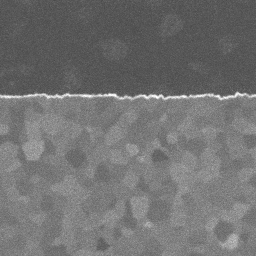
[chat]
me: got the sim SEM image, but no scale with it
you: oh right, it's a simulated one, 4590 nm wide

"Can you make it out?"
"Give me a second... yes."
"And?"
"one or a few lines or trenches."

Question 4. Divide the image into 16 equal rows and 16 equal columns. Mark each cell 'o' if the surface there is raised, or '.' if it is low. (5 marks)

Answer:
................
................
................
................
................
................
oooooooooooooooo
oooooooooooooooo
oooooooooooooooo
oooooooooooooooo
oooooooooooooooo
oooooooooooooooo
oooooooooooooooo
oooooooooooooooo
oooooooooooooooo
oooooooooooooooo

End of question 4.